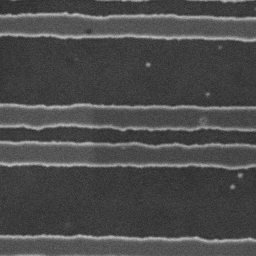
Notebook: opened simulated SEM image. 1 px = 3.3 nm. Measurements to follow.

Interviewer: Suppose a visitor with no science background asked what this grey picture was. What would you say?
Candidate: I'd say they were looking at lines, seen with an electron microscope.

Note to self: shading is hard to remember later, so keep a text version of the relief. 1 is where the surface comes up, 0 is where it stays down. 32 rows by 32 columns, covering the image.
00000000000000000000000000000000
00000000000000000000000000000000
11111111111111111111111111111111
11111111111111111111111111111111
00011111111111111111111111111111
00000000000000000000000000000000
00000000000000000000000000000000
00000000000000000000000000000000
00000000000000000000000000000000
00000000000000000000000000000000
00000000000000000000000000000000
00000000000000000000000000000000
00000000000000000000000000000000
11111111111111111111111111111111
11111111111111111111111111111111
11111111111111111111111111111111
00000000000000000000000000000000
00000000000000000000000000000000
11111111111111111111111111111111
11111111111111111111111111111111
11111111111111111111111111111111
00000000000000000000000000000000
00000000000000000000000000000000
00000000000000000000000000000000
00000000000000000000000000000000
00000000000000000000000000000000
00000000000000000000000000000000
00000000000000000000000000000000
00000000000000000000000000000000
00000110011000000000000000000000
11111111111111111111111111111111
11111111111111111111111111111111